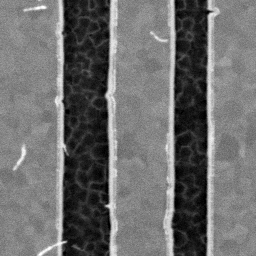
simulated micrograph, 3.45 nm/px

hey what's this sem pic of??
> one or a few lines or trenches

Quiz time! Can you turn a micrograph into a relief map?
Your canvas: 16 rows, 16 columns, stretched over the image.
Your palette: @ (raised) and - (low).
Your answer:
@@@@---@@@@--@@@
@@@@---@@@@--@@@
@@@@---@@@@--@@@
@@@@---@@@@--@@@
@@@@---@@@@--@@@
@@@@---@@@@--@@@
@@@@---@@@@--@@@
@@@@---@@@@--@@@
@@@@---@@@@--@@@
@@@@---@@@@--@@@
@@@@---@@@@--@@@
@@@@---@@@@--@@@
@@@@---@@@@--@@@
@@@@---@@@@--@@@
@@@@---@@@@--@@@
@@@@---@@@@--@@@